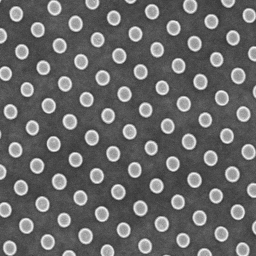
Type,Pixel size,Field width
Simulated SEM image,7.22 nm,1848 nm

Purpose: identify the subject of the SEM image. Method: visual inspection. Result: a regular array of raised bodies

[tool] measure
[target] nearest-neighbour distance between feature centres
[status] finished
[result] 0.194 µm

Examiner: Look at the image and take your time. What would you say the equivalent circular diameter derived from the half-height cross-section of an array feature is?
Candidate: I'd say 0.101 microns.